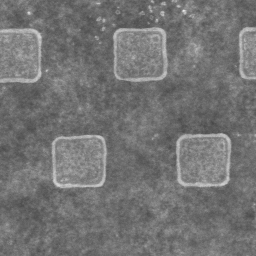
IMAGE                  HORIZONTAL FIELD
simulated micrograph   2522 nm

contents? raised bodies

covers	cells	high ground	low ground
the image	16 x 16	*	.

................
................
**.....***.....*
**.....***.....*
**.....***.....*
................
................
................
.....*......**..
...****....***..
...****....***..
....**......**..
................
................
................
................